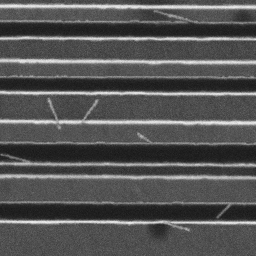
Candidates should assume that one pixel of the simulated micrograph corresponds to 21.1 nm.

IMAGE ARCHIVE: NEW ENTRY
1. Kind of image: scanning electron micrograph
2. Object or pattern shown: lines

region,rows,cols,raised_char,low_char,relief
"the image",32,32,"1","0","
00000000000000000000000000000000
11111111111111111111111111111111
11111111111111111111111111111111
11111111111111111111111111111111
11111111111111111111111111111111
00000000000000000000000000000000
00000000000000000000000000000000
00000000000000000000000000000000
11111111111111111111111111111111
11111111111111111111111111111111
11111111111111111111111111111111
00000001001111111111111111111111
00000000000000000000000000000000
00000000000000000000000000000000
00000000000000000000000000000000
11111111111111111111111111110100
11111111111111111111111111111111
11111111111111111111111111111111
11111111111111111111111111111111
11111111111111111111111111111111
00000000000000001001001111111111
00000000000000000000000000000000
11111111111111111111111111111111
11111111111111111111111111111111
11111111111111111111111111111111
11111111111111111111111111111111
11111111111111111111111111111111
11111111111111111111111111111111
00000000000000000000000000000000
00000000000000000000000000000000
00000000000000000000000000000000
00000000000000000000000000000000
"